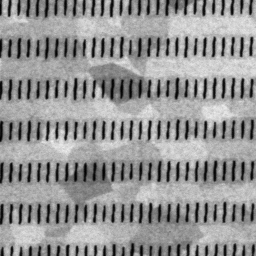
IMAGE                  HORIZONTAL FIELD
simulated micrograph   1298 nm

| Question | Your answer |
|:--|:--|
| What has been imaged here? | a regular array of holes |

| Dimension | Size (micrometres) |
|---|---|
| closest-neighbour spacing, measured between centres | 0.0462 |